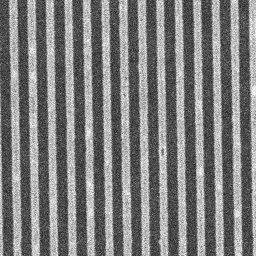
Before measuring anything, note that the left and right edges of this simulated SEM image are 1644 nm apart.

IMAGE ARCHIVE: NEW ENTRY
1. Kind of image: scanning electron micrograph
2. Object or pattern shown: parallel lines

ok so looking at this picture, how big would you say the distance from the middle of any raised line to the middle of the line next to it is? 118 nanometres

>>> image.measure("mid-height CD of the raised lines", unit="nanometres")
45.7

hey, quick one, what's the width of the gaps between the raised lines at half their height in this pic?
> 0.0738 microns